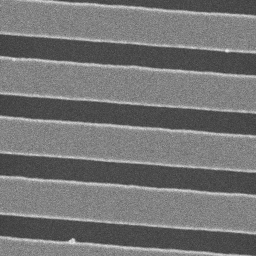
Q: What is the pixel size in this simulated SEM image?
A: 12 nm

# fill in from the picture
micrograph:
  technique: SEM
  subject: lines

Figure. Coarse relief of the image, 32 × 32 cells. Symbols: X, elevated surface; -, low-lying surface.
XXXXXXXXXXXX--------------------
XXXXXXXXXXXXXXXXXXXXXXXXX-------
XXXXXXXXXXXXXXXXXXXXXXXXXXXXXXXX
XXXXXXXXXXXXXXXXXXXXXXXXXXXXXXXX
---XXXXXXXXXXXXXXXXXXXXXXXXXXXXX
-----------------XXXXXXXXXXXXXXX
------------------------------XX
XXXXXX--------------------------
XXXXXXXXXXXXXXXXXXX-------------
XXXXXXXXXXXXXXXXXXXXXXXXXXXXXXXX
XXXXXXXXXXXXXXXXXXXXXXXXXXXXXXXX
XXXXXXXXXXXXXXXXXXXXXXXXXXXXXXXX
---------XXXXXXXXXXXXXXXXXXXXXXX
------------------------XXXXXXXX
X-------------------------------
XXXXXXXXXXXXX-------------------
XXXXXXXXXXXXXXXXXXXXXXXXXX------
XXXXXXXXXXXXXXXXXXXXXXXXXXXXXXXX
XXXXXXXXXXXXXXXXXXXXXXXXXXXXXXXX
-----XXXXXXXXXXXXXXXXXXXXXXXXXXX
------------------XXXXXXXXXXXXXX
--------------------------------
XXXXXXXX------------------------
XXXXXXXXXXXXXXXXXXXX------------
XXXXXXXXXXXXXXXXXXXXXXXXXXXXXXXX
XXXXXXXXXXXXXXXXXXXXXXXXXXXXXXXX
XXXXXXXXXXXXXXXXXXXXXXXXXXXXXXXX
--------XXXXXXXXXXXXXXXXXXXXXXXX
---------------------XXXXXXXXXXX
--------------------------------
XXXXXXXXXXXXX-------------------
XXXXXXXXXXXXXXXXXXXXXXXXXX------